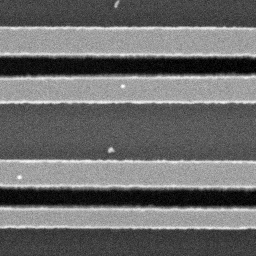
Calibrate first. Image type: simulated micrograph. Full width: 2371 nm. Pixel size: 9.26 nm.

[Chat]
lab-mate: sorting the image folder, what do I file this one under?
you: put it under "lines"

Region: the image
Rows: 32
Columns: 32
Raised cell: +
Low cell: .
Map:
................................
................................
................................
+++++++++++++++++++++++++++.++..
++++++++++++++++++++++++++++++++
++++++++++++++++++++++++++++++++
++++++++++++++++++++++++++++++++
................................
................................
............................++.+
++++++++++++++++++++++++++++++++
++++++++++++++++++++++++++++++++
++++++++++++++++++++++++++++++++
................................
................................
................................
................................
................................
................................
................................
++++++++++++++++++++++++++++++++
++++++++++++++++++++++++++++++++
++++++++++++++++++++++++++++++++
................................
................................
................................
++++++++++++++++++++++++++++++++
++++++++++++++++++++++++++++++++
...................++++++++++++.
................................
................................
................................